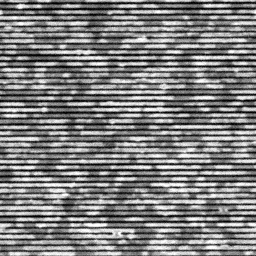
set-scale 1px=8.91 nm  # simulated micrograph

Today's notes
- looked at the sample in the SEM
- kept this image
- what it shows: parallel lines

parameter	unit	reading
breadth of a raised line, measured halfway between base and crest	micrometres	0.0267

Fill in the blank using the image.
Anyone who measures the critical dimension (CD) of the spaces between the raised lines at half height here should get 2.87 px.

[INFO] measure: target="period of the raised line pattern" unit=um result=0.0512